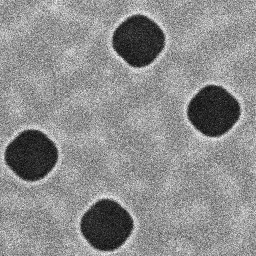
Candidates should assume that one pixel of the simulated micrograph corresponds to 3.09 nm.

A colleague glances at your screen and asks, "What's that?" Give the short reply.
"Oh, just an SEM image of holes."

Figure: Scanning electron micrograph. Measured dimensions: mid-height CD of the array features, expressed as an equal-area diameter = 160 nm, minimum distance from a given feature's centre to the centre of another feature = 317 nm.